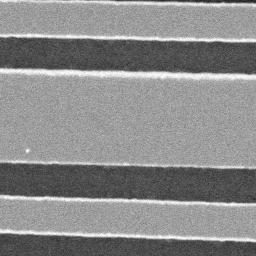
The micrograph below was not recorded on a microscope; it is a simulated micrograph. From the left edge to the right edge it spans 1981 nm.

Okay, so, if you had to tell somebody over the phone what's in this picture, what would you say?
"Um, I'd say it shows lines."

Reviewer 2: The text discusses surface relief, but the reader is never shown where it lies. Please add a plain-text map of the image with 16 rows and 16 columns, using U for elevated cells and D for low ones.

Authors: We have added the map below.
UUUUUUUUUUUUUUUU
UUUUUUUUUUUUUUUU
DDDDDDDDDDUUUUUU
DDDDDDDDDDDDDDDD
UUUUUUUUDDDDDDDD
UUUUUUUUUUUUUUUU
UUUUUUUUUUUUUUUU
UUUUUUUUUUUUUUUU
UUUUUUUUUUUUUUUU
UUUUUUUUUUUUUUUU
DDDDDDDDDDDDDDDD
DDDDDDDDDDDDDDDD
UUUUUUUUUDDDDDDD
UUUUUUUUUUUUUUUU
UUUUUUUUUUUUUUUU
DDDDDDDDDDDDDDDD